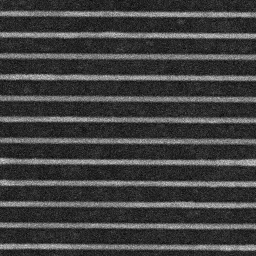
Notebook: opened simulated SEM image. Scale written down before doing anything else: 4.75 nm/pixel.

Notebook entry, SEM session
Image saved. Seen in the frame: parallel lines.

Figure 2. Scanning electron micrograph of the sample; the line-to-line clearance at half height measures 76 nanometres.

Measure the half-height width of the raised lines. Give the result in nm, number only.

24.3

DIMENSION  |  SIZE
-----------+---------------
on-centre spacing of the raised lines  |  101 nm